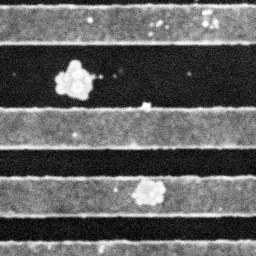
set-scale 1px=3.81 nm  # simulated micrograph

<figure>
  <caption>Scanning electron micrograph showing lines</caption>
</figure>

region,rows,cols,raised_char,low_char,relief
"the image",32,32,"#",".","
................................
################################
################################
################################
################################
................................
................................
................................
................................
................................
................................
................................
................................
.................##........#....
################################
################################
################################
################################
#############.######.......#....
................................
................................
................................
################################
################################
################################
################################
################################
................................
................................
................................
################################
################################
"